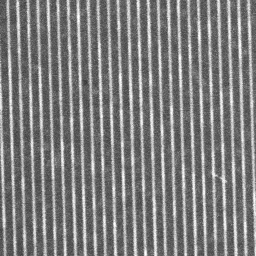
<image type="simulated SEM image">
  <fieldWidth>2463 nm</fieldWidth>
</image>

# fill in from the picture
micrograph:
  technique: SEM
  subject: parallel lines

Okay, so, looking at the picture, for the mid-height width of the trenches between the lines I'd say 79.4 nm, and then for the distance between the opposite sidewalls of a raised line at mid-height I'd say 19.2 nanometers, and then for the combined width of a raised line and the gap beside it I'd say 96.6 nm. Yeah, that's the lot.